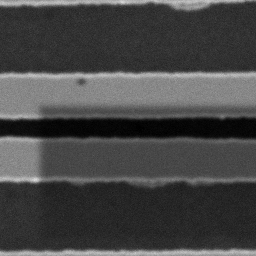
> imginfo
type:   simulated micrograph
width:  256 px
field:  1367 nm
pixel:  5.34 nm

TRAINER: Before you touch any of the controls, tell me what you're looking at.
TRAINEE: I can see lines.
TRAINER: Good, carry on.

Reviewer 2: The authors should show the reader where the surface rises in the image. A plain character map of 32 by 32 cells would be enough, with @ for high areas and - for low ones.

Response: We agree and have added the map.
@@@@@@@-------------------------
--------------------------------
--------------------------------
--------------------------------
--------------------------------
--------------------------------
--------------------------------
--------------------------------
--------------------------------
@@@@@@@@@@@@@@@@@@@@@@@@@@@@@@@@
@@@@@@@@@@@@@@@@@@@@@@@@@@@@@@@@
@@@@@@@@@@@@@@@@@@@@@@@@@@@@@@@@
@@@@@@@@@@@@@@@@@@@@@@@@@@@@@@@@
@@@@@@@@@@@@@@@@@@@@@@@@@@@@@@@@
@@@@@@@@@@@@@@@@@@@@@@@@@@@@@@@@
--------------------------------
--------------------------------
@@@@@@@@@@@@@@@@@@@@@@@@@@@@@@@@
@@@@@@@@@@@@@@@@@@@@@@@@@@@@@@@@
@@@@@@@@@@@@@@@@@@@@@@@@@@@@@@@@
@@@@@@@@@@@@@@@@@@@@@@@@@@@@@@@@
@@@@@@@@@@@@@@@@@@@@@@@@@@@@@@@@
@@@@@@@@@-@@@@@-@@@@@@@@@@@@@@@@
--------------------------------
--------------------------------
--------------------------------
--------------------------------
--------------------------------
--------------------------------
--------------------------------
--------------------------------
--@@@@@@@@@@@@@@@@@@@@@@@@@@@@@@